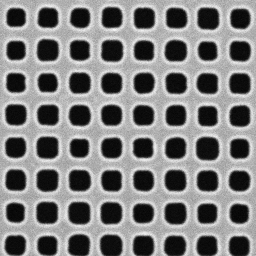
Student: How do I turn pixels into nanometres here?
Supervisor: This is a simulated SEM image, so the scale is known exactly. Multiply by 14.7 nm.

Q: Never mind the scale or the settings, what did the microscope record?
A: a regular array of holes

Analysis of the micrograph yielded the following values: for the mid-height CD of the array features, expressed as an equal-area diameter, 23 pixels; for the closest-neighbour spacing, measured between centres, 466 nm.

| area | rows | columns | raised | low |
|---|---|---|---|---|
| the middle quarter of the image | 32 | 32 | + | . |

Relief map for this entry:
++++++++++++++++++++++++++++++++
++++++++++++++++++++++++++++++++
++....++++....++++....++++....++
+......++......++......++......+
+......++......++......++......+
+......++......++......++......+
+......+++.....+++....+++......+
++...++++++..++++++.+++++++...++
++++++++++++++++++++++++++++++++
++++++++++++++++++++++++++++++++
++....++++....++++....++++....++
+.....+++......++.....+++......+
+......++......++......++......+
+......++......++......++......+
+.....+++......++......++.....++
+++..++++++..+++++++++++++...+++
++++++++++++++++++++++++++++++++
++++++++++++++++++++++++++++++++
+++..+++++....++++...++++++...++
+.....+++......++.....+++.....++
+.....+++......++.....+++......+
+.....+++......++.....+++......+
+.....+++......++.....+++......+
+++..++++++...++++....++++....++
++++++++++++++++++++++++++++++++
++++++++++++++++++++++++++++++++
++...++++++++++++++..+++++...+++
+.....+++.....+++.....+++.....++
+......++......++......++......+
+......++......++......++......+
+......++......++......++......+
++....++++....++++....++++....++